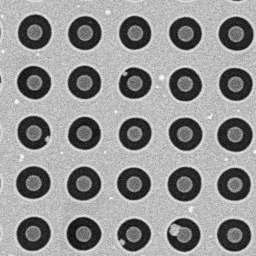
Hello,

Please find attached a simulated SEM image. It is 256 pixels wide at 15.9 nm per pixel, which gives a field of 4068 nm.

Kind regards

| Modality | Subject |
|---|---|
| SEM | an array of small figures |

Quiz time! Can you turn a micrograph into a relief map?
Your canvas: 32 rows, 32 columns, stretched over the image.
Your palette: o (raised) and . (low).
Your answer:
oooooooooooooooooooooooooooooooo
oooooooooooooooooooooooooooooooo
ooo...ooo...oooo..oooo...ooo...o
oo....ooo....oo....oo....oo.....
oo....oo.....oo....oo....oo.....
ooo...ooo...ooo....ooo...ooo...o
oooooooooooooooooooooooooooooooo
oooooooooooooooooooooooooooooooo
ooo..oooo...oooo..oooo..ooooo.oo
oo....ooo....oo....oo....oo....o
oo....oo.....oo....oo....oo.....
oo....ooo...ooo....oo....ooo...o
oooo.ooooooooooooooooo..ooooo.oo
oooooooooooooooooooooooooooooooo
ooo..ooooooooooooooooooooooooooo
oo....ooo...ooo....oo....ooo...o
oo....oo.....oo....oo....oo.....
oo....ooo....oo....oo....oo.....
ooo..oooo...oooo..oooo...ooo...o
oooooooooooooooooooooooooooooooo
oooooooooooooooooooooooooooooooo
oo....ooo...ooo...ooo....ooo...o
oo....oo.....oo....oo....oo....o
oo....oo.....oo....oo....oo....o
ooo...ooo...ooo...ooo....ooo...o
oooooooooooooooooooooooooooooooo
oooooooooooooooooooooooooooooooo
ooo...ooo...oooo..oooo..oooo..oo
oo....oo.....oo....oo....oo....o
oo....oo.....oo....oo....oo....o
oo....ooo...ooo...ooo....oo....o
oooooooooooooooooooooo..oooooooo